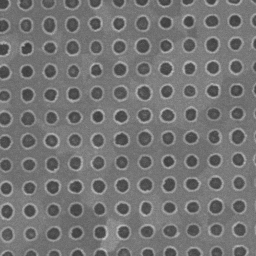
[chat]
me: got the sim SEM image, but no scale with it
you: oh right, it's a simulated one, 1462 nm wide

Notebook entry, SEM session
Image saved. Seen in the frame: a regular array of holes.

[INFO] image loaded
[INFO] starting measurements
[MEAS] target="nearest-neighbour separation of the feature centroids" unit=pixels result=22.8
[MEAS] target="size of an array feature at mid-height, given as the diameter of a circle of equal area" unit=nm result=74.5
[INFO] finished